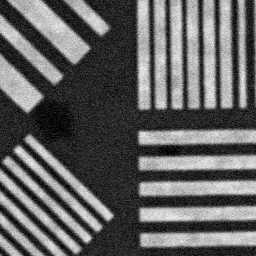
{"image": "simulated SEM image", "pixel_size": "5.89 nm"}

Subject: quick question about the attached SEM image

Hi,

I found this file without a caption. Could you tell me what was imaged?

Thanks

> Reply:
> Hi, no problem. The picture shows groups of lines, slits or small figures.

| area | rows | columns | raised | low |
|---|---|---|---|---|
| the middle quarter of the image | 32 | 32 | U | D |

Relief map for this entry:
DDDDDDDDDDDDDDDDDDDUUDDUUDDUUDDU
DDDDDDDDDDDDDDDDDDDUUDDUUDDUUDDU
DDDDDDDDDDDDDDDDDDDUUDDUUDDUUDDU
DDDDDDDDDDDDDDDDDDDUUDDUUDDUUDDU
DDDDDDDDDDDDDDDDDDDUUDDUUDDUUDDU
DDDDDDDDDDDDDDDDDDDUUDDUUDDUUDDU
DDDDDDDDDDDDDDDDDDDUUDDUUDDUUDDU
DDDDDDDDDDDDDDDDDDDUUDDUUDDUUDDU
DDDDDDDDDDDDDDDDDDDUUDDUUDDUUDDU
DDDDDDDDDDDDDDDDDDDUUDDUUDDUUDDU
DDDDDDDDDDDDDDDDDDDUUDDUUDDUUDDU
DDDDDDDDDDDDDDDDDDDDDDDDDDDDDDDD
DDDDDDDDDDDDDDDDDDDDDDDDDDDDDDDD
DDDDDDDDDDDDDDDDDDDDDDDDDDDDDDDD
DDDDDDDDDDDDDDDDDDDDDDDDDDDDDDDD
DDDDDDDDDDDDDDDDDDDDDDDDDDDDDDDD
DDDDDDDDDDDDDDDDDDDDDDDDDDDDDDDD
DDDDDDDDDDDDDDDDDDDUUUUUUUUUUUUU
DDDDDDDDDDDDDDDDDDDUUUUUUUUUUUUU
DDDDDDDDDDDDDDDDDDDUUUUUUUUUUUUU
DDDDDDDDDDDDDDDDDDDDDDDDDDDDDDDD
DDDDDDDDDDDDDDDDDDDDDDDDDDDDDDDD
DDDDDDDDDDDDDDDDDDDDDDDDDDDDDDDD
DDDDDDDDDDDDDDDDDDDUUUUUUUUUUUUU
DDDDDDDDDDDDDDDDDDDUUUUUUUUUUUUU
DDDDDDDDDDDDDDDDDDDUUUUUUUUUUUUU
UDDDDDDDDDDDDDDDDDDDDDDDDDDDDDDD
UUDDDDDDDDDDDDDDDDDDDDDDDDDDDDDD
UUUDDDDDDDDDDDDDDDDDDDDDDDDDDDDD
DUUUDDDDDDDDDDDDDDDDDDDDDDDDDDDD
DDUUUDDDDDDDDDDDDDDUUUUUUUUUUUUU
DDDUUUDDDDDDDDDDDDDUUUUUUUUUUUUU